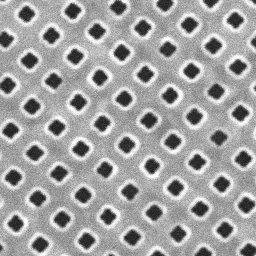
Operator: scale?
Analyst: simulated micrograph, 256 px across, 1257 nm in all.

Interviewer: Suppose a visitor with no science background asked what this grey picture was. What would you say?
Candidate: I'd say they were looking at a regular array of holes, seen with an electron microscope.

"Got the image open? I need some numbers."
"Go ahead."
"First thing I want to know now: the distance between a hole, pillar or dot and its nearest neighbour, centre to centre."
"158 nanometers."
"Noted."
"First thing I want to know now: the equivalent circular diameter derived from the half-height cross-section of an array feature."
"0.0789 µm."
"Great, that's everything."